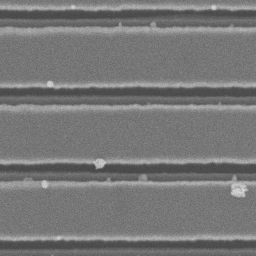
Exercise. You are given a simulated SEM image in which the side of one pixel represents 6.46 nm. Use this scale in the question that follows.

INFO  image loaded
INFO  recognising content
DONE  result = lines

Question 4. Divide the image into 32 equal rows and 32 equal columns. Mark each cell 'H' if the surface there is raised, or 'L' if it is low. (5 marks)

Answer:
HHHHHHHHHHHHHHHHHHHHHHHHHHHHHHHH
LLLLLLLLLLLLLLLLLLLLLLLLLLLLLLLL
LLLLLLLLLLLLLLLLLLLLLLLLLLLLLLLL
HHHHHHHHHHHHHHHHHHHHHHHHHHHHHHHH
HHHHHHHHHHHHHHHHHHHHHHHHHHHHHHHH
HHHHHHHHHHHHHHHHHHHHHHHHHHHHHHHH
HHHHHHHHHHHHHHHHHHHHHHHHHHHHHHHH
HHHHHHHHHHHHHHHHHHHHHHHHHHHHHHHH
HHHHHHHHHHHHHHHHHHHHHHHHHHHHHHHH
HHHHHHHHHHHHHHHHHHHHHHHHHHHHHHHH
HHHHHHHHHHHHHHHHHHHHHHHHHHHHHHHH
LLLLLLLLLLLLLLLLLLLLLLLLLLLLLLLL
LLLLLLLLLLLLLLLLLLLLLLLLLLLLLLLL
HHHHHHHHHHHHHHHHHHHHHHHHHHHHHHHH
HHHHHHHHHHHHHHHHHHHHHHHHHHHHHHHH
HHHHHHHHHHHHHHHHHHHHHHHHHHHHHHHH
HHHHHHHHHHHHHHHHHHHHHHHHHHHHHHHH
HHHHHHHHHHHHHHHHHHHHHHHHHHHHHHHH
HHHHHHHHHHHHHHHHHHHHHHHHHHHHHHHH
HHHHHHHHHHHHHHHHHHHHHHHHHHHHHHHH
HHLHLLLLLLLHHLLLHHLLLLHLLLLLLLLL
LLLLLLLLLLLLLLLLLLLLLLLLLLLLLLLL
LLLHLLLLLLLLLHLLLHHLLLLLLLLLLHLL
HHHHHHHHHHHHHHHHHHHHHHHHHHHHHHHH
HHHHHHHHHHHHHHHHHHHHHHHHHHHHHHHH
HHHHHHHHHHHHHHHHHHHHHHHHHHHHHHHH
HHHHHHHHHHHHHHHHHHHHHHHHHHHHHHHH
HHHHHHHHHHHHHHHHHHHHHHHHHHHHHHHH
HHHHHHHHHHHHHHHHHHHHHHHHHHHHHHHH
HHHHHHHHHHHHHHHHHHHHHHHHHHHHHHHH
LLLLLLLLLLLLLLLLLLLLLLLLLLLLLLLL
LLLLLLLLLLLLLLLLLLLLLLLLLLLLLLLL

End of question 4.